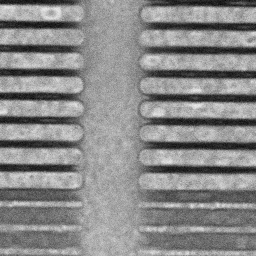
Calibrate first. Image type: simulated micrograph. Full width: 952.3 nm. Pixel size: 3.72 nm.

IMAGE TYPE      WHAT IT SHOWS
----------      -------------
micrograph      groups of lines, slits or small figures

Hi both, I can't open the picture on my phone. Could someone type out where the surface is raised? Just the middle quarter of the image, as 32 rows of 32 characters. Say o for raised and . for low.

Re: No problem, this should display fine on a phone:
oooo...............ooooooooooooo
................................
................................
ooo.............................
oooo...............ooooooooooooo
ooooo..............ooooooooooooo
oooo...............ooooooooooooo
................................
................................
oooo............................
oooo...............ooooooooooooo
ooooo..............ooooooooooooo
oooo...............ooooooooooooo
................................
................................
oooo................oooooooooo..
oooo...............ooooooooooooo
ooooo..............ooooooooooooo
oooo...............ooooooooooooo
................................
................................
ooo.............................
oooo...............ooooooooooooo
oooo...............ooooooooooooo
oooo...............ooooooooooooo
................................
................................
oooo................ooooooooo...
oooo...............ooooooooooooo
oooo...............ooooooooooooo
oooo...............ooooooooooooo
................................